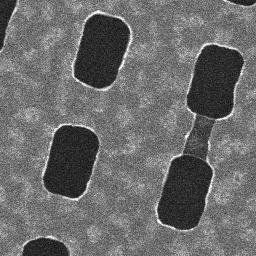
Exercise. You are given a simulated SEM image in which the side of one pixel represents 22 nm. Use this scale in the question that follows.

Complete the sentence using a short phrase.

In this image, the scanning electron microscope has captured holes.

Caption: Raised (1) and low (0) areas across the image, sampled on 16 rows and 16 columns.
0111111111111111
0111100011111111
1111100011111111
1111100011110001
1111100111110001
1111111111110001
1111111111110001
1111111111110011
1110001111110111
1110001111100111
1110001111100111
1110011111000111
1111111111000111
1111111111000111
1111111111111111
1100111111111111